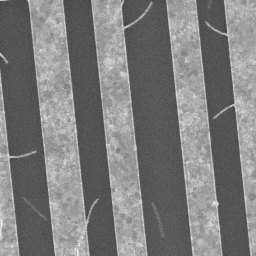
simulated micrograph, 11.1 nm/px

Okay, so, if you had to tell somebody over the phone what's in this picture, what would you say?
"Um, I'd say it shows groups of lines, slits or small figures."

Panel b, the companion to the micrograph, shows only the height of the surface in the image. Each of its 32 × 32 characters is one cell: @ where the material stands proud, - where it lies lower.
----@@@@---@@@@------@@@@---@@@@
----@@@@----@@@------@@@@---@@@@
----@@@@----@@@------@@@@---@@@@
----@@@@----@@@@-----@@@@---@@@@
----@@@@----@@@------@@@@---@@@@
----@@@@----@@@@-----@@@@----@@@
----@@@@@---@@@@------@@@----@@@
----@@@@@---@@@@------@@@----@@@
----@@@@@---@@@@------@@@----@@@
-----@@@@---@@@@------@@@----@@@
-----@@@@---@@@@------@@@@---@@@
-----@@@@----@@@------@@@@---@@@
-----@@@@----@@@------@@@@---@@@
-----@@@@----@@@------@@@@---@@@
@----@@@@----@@@@-----@@@@----@@
@----@@@@----@@@@-----@@@@----@@
@----@@@@@---@@@@------@@@----@@
@----@@@@@---@@@@------@@@----@@
@-----@@@@---@@@@------@@@----@@
@-----@@@@----@@@------@@@@---@@
@-----@@@@----@@@------@@@@---@@
@-----@@@@----@@@------@@@@---@@
@-----@@@@----@@@------@@@@---@@
@-----@@@@----@@@------@@@@---@@
@@----@@@@----@@@@-----@@@@----@
@@----@@@@@---@@@@------@@@----@
@@----@@@@@---@@@@------@@@----@
@@----@@@@@---@@@@------@@@----@
@@-----@@@@---@@@@------@@@----@
@@-----@@@@---@@@@------@@@@---@
@@-----@@@@----@@@------@@@@---@
@@-----@@@@----@@@------@@@@---@